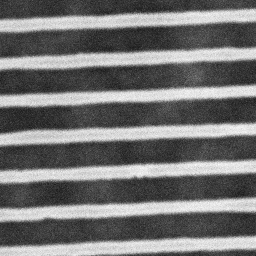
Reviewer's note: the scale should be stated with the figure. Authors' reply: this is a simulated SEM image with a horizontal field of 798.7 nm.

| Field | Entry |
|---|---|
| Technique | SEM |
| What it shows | parallel lines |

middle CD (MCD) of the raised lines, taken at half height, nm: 35.1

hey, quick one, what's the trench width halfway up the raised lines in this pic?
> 0.0834 microns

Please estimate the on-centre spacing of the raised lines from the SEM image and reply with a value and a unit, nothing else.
118 nm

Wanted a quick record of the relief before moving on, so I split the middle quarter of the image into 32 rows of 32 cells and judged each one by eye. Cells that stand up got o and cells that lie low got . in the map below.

oooooo..........................
................................
................................
................................
................................
................................
.........................ooooooo
oooooooooooooooooooooooooooooooo
oooooooooooooooooooooooooooooooo
oooooooooo......................
................................
................................
................................
................................
................................
................................
...ooooooooooooooooooooooooooooo
oooooooooooooooooooooooooooooooo
oooooooooooooooooooooo..........
................................
................................
................................
................................
................................
................................
.................oo.oooooooooooo
.ooooooooooooooooooooooooooooooo
oooooooooooooooooooooooooooooooo
oooooooooooo....................
................................
................................
................................